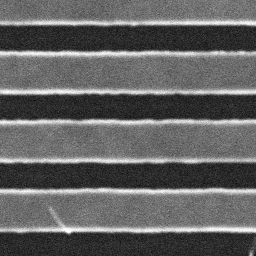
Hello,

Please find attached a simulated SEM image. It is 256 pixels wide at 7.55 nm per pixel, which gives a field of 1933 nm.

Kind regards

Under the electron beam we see lines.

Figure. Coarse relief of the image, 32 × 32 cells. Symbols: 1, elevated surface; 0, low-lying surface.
11111111111111111111111111111111
11111111111111111111111111111111
11111111111111111111111111111111
00000000000000000000000000000000
00000000000000000000000000000000
00000000000000000000000000000000
11111000100001000011110000110111
11111111111111111111111111111111
11111111111111111111111111111111
11111111111111111111111111111111
11111111111111111111111111111111
11111111111111111111111111111111
00000000000000000000000000000000
00000000000000000000000000000000
00000000000000000000000000000000
11111111111111111111111111111111
11111111111111111111111111111111
11111111111111111111111111111111
11111111111111111111111111111111
11111111111111111111111111111111
00000000000000000000000000000000
00000000000000000000000000000000
00000000000000000000000000000000
00000000000000000000000000000000
11111111111111111111111111111111
11111111111111111111111111111111
11111111111111111111111111111111
11111111111111111111111111111111
11111111111111111111111111111111
00000000000000000000000000000000
00000000000000000000000000000000
00000000000000000000000000000000